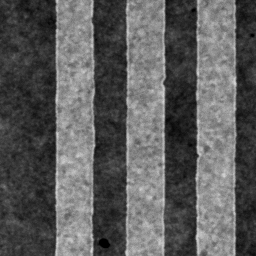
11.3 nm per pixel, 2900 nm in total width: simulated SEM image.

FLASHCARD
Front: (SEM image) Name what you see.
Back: one or a few lines or trenches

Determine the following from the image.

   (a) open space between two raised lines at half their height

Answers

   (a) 34 pixels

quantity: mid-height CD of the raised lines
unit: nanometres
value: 415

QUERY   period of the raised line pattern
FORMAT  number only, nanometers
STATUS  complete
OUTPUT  798